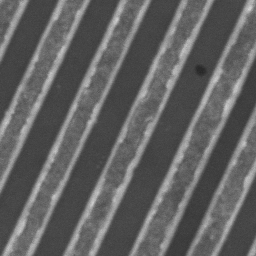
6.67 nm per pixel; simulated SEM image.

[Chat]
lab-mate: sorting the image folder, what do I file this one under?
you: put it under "parallel lines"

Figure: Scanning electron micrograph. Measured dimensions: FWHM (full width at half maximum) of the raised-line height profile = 167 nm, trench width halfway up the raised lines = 216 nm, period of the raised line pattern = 56.8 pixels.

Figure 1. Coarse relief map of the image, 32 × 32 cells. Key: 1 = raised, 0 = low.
11100001111000011100000111000001
11100001110000011100001111000001
11000001110000111000001110000011
11000011100000111000011110000011
10000011100001110000011100000111
10000111000001110000111100000111
00000111000011110000111000001111
00001110000011100000111000001110
00001110000111100001110000011110
00011110000111000001110000011100
00011100001111000011110000111100
00111100001110000011100000111100
00111000001110000111100001111000
01111000011100000111000001111000
01110000011100001111000001110000
11110000111000001110000011110001
11100000111000011110000011100001
11100001110000011100000111100011
11000001110000111100000111000011
11000011100000111000001111000111
10000011100001111000001110000111
10000111100001110000011110001111
00000111000001110000011110001110
00000111000011110000111100011110
00001110000011100000111100011100
00001110000111100001111000011100
00011100000111000001111000111000
00011100001111000001110000111000
00111000001110000011110001110000
00111000011110000011100001110000
01110000011100000111100011110000
01110000111100000111000011100001